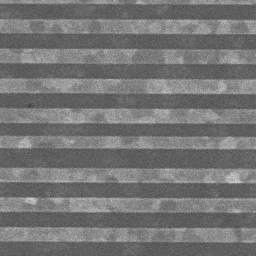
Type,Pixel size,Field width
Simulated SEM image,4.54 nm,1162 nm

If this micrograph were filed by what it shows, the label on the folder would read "parallel lines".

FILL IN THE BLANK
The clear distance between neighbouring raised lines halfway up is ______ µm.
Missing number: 0.0726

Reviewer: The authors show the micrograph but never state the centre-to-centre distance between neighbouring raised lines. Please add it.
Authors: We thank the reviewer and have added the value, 0.135 um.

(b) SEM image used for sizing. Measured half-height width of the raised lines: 0.0596 microns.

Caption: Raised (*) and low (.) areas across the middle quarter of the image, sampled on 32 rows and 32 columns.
................................
................................
....*...........................
................................
********************************
********************************
********************************
................................
................................
................................
................................
********************************
********************************
********************************
********************************
................................
................................
................................
********************************
********************************
********************************
................................
................................
................................
................................
................................
********************************
********************************
********************************
................................
................................
................................